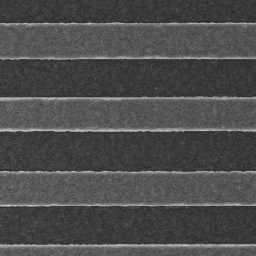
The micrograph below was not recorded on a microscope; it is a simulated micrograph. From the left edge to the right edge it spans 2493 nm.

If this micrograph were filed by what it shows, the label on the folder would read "lines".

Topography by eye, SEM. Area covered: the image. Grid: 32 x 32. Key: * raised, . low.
................................
................................
................................
********************************
********************************
********************************
********************************
................................
................................
................................
................................
................................
********************************
********************************
********************************
********************************
................................
................................
................................
................................
................................
*.*.*..*.*****....**.*...*******
********************************
********************************
********************************
********************************
................................
................................
................................
................................
................................
********************************